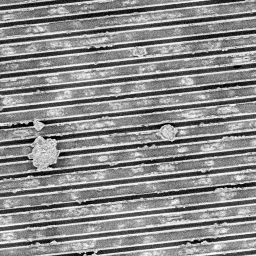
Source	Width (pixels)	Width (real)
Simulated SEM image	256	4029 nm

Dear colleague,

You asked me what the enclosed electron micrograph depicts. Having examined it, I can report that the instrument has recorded parallel lines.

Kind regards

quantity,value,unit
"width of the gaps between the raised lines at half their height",91.9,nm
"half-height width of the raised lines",184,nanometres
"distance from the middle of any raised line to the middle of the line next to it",266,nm